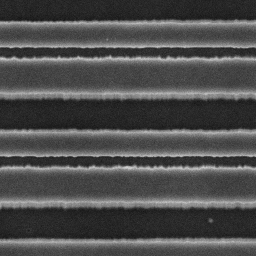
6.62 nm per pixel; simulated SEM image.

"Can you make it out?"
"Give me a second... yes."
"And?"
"lines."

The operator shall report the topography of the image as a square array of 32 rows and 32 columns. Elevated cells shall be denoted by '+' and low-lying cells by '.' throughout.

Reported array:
................................
................................
................................
++++++++++++++++++++++++++++++++
++++++++++++++++++++++++++++++++
++++++++++++++++++++++++++++++++
++++++++++++++++++++++++++++++++
++++++++++++++++++++++++++++++++
++++++++++++++++++++++++++++++++
++++++++++++++++++++++++++++++++
++++++++++++++++++++++++++++++++
++++++++++++++++++++++++++++++++
................................
................................
................................
................................
+++++++++++++++..+++.+++++...++.
++++++++++++++++++++++++++++++++
++++++++++++++++++++++++++++++++
++++++++++++++++++++++++++++++++
++++++++++++++++++++++++++++++++
++++++++++++++++++++++++++++++++
++++++++++++++++++++++++++++++++
++++++++++++++++++++++++++++++++
++++++++++++++++++++++++++++++++
........+................+..+.++
................................
................................
................................
................................
++++++++++++++++++++++++++++++++
++++++++++++++++++++++++++++++++